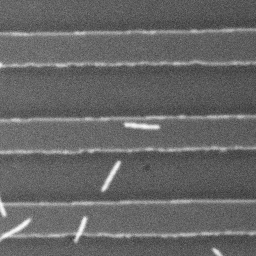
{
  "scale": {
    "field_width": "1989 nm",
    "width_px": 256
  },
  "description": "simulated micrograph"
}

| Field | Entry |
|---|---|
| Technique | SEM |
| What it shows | lines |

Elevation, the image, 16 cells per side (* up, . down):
................
................
****************
****************
................
................
................
****************
****************
*****...........
................
................
................
****************
****************
................